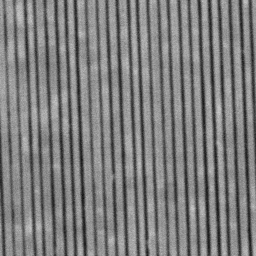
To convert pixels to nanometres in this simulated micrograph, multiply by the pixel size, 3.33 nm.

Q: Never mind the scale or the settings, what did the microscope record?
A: parallel lines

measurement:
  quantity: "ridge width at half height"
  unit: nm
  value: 25.4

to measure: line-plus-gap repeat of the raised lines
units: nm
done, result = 34.1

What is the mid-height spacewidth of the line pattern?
8.7 nm